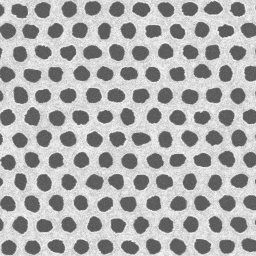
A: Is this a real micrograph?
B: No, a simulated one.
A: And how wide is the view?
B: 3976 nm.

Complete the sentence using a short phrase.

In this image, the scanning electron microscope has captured a regular array of holes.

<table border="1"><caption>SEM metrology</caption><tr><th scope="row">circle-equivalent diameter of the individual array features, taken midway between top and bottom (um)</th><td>0.243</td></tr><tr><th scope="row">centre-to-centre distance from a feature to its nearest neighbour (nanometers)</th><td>366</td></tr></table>